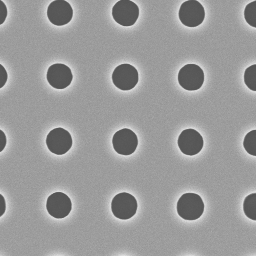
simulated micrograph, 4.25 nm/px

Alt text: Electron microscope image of a regular array of holes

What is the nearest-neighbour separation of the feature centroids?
273 nm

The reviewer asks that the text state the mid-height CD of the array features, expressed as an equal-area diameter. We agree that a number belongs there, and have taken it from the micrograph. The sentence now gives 110 nm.